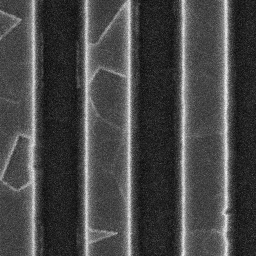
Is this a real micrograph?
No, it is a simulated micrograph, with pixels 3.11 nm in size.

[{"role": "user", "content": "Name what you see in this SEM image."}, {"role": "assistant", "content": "one or a few lines or trenches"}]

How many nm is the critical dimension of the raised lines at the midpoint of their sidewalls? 134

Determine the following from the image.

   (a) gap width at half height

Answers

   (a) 166 nm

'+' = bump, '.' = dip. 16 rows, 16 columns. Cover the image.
++...+++...+++..
++...+++...+++..
++...+++...+++..
++...+++...+++..
++...+++...+++..
++...+++...+++..
++...+++...+++..
++...+++...+++..
++...+++...+++..
++...+++...+++..
++...+++...+++..
++...+++...+++..
++...+++...+++..
++...+++...+++..
++...+++...+++..
++...+++...+++..